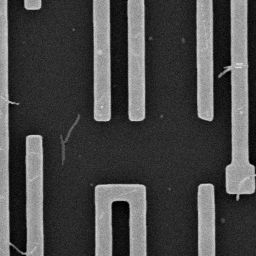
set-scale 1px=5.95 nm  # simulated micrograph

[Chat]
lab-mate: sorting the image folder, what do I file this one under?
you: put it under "wiring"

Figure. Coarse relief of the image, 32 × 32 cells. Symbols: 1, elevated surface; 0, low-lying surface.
10011000000011001100000001000110
10000000000011001100000001100110
10000000000011001100000001100110
10000000000011001100000001100110
10000000000011001100000001100110
10000000000011001100000001100110
10000000000011001100000001100110
10000000000011001100000001100110
10000000000011001100000001100110
10000000000011001100000001100110
10000000000011001100000001100110
10000000000011001100000001100110
10000000000011001100000001100110
10000000000011001100000001100110
10000000000011001100000001100110
10000000000000000000000000000110
10000000000000000000000000000110
10011000000000000000000000000110
10011000000000000000000000000110
10011000000000000000000000000110
10011000000000000000000000000110
10011000000000000000000000001111
10011000000000000000000000001111
10011000000011111100000001101111
10011000000011111100000001100000
10011000000011001100000001100000
10011000000011001100000001100000
10011000000011001100000001100000
10011000000011001100000001100000
10011000000011001100000001100000
10011000000011001100000001100000
10011000000011001100000001100000